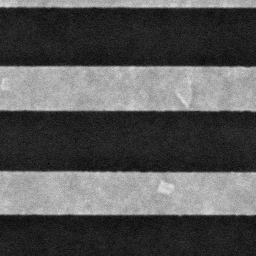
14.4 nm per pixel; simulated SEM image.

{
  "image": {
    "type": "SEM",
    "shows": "lines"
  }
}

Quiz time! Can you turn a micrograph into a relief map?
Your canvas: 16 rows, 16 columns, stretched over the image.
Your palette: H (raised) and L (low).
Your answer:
LLLLLLLLLLLLLLLL
LLLLLLLLLLLLLLLL
LLLLLLLLLLLLLLLL
LLLLLLLLLLLLLLLL
HHHHHHHHHHHHHHHH
HHHHHHHHHHHHHHHH
HHHHHHHHHHHHHHHH
LLLLLLLLLLLLLLLL
LLLLLLLLLLLLLLLL
LLLLLLLLLLLLLLLL
LLLLLLLLLLLLLLLL
HHHHHHHHHHHHHHHH
HHHHHHHHHHHHHHHH
LLLLLLLLLLLLLLLL
LLLLLLLLLLLLLLLL
LLLLLLLLLLLLLLLL